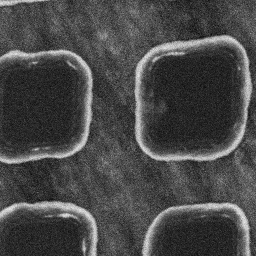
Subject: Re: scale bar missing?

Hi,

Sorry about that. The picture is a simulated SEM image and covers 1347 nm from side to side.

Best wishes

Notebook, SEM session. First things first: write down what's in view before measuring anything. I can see raised bodies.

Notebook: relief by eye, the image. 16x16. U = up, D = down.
DDDDDDDDDDDDDDDD
DDDDDDDDDDDDDDDD
DDDDDDDDDDDDDUUD
UUUUUDDDDUUUUUUD
UUUUUUDDDUUUUUUU
UUUUUUDDDUUUUUUU
UUUUUUDDDUUUUUUU
UUUUUUDDDUUUUUUD
UUUUUDDDDUUUUUUD
UUUUUDDDDUUUUUDD
DDDDDDDDDDDDDDDD
DDDDDDDDDDDDDDDD
DDDDDDDDDDDDDDDD
UUUUUUDDDDUUUUUD
UUUUUUDDDUUUUUUU
UUUUUUDDDUUUUUUU